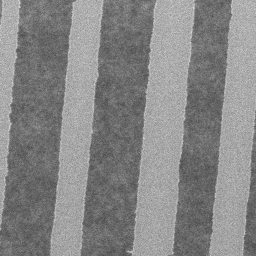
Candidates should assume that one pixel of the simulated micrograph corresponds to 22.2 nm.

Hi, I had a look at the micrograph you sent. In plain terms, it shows one or a few lines or trenches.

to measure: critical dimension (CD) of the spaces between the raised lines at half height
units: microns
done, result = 1.15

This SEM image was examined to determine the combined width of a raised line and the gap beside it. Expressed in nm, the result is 1830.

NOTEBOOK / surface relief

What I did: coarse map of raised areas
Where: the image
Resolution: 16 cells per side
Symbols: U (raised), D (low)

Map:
UDDDDUDDDDUUDDUU
UDDDUUDDDDUUDDUU
UDDDUUDDDUUUDDUU
UDDDUUDDDUUUDDUU
UDDDUUDDDUUUDDUU
UDDDUUDDDUUUDDUU
UDDDUUDDDUUUDDUU
UDDDUUDDDUUDDDUU
UDDDUUDDDUUDDDUU
DDDDUUDDDUUDDDUU
DDDDUUDDDUUDDDUU
DDDDUDDDDUUDDDUU
DDDDUDDDDUUDDUUD
DDDUUDDDUUUDDUUD
DDDUUDDDUUUDDUUD
DDDUUDDDUUUDDUUD